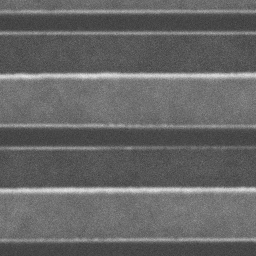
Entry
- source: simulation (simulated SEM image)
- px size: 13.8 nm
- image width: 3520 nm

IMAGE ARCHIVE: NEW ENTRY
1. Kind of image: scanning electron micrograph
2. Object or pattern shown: lines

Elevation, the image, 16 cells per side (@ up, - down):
@@@@@@@@@@@@@@@@
@@@@@@@@@@@@@@@@
----------------
----------------
----------------
@@@@@@@@@@@@@@@@
@@@@@@@@@@@@@@@@
@@@@@@@@@@@@@@@@
@@@@@@@@@@@@@@@@
----------------
----------------
----------------
@@@@@@@@@@@@@@@@
@@@@@@@@@@@@@@@@
@@@@@@@@@@@@@@@@
@@@@@@@@@@@@@@@@